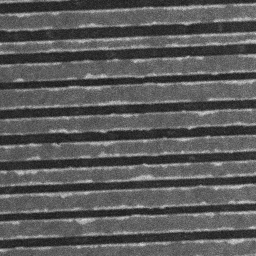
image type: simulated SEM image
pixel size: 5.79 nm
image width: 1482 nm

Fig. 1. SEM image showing parallel lines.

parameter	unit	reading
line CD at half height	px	16.9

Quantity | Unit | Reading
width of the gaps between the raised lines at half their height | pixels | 9.36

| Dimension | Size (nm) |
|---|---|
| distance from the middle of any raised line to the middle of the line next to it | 150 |